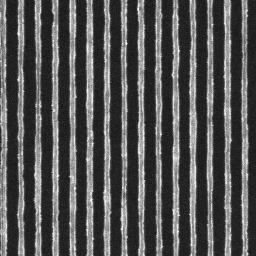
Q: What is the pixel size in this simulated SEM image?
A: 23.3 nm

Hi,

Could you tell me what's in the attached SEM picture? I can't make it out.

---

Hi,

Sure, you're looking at parallel lines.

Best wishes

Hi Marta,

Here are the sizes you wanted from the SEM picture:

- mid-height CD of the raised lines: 315 nanometres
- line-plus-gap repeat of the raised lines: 402 nanometers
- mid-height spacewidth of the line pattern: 78.7 nanometres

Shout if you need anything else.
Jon